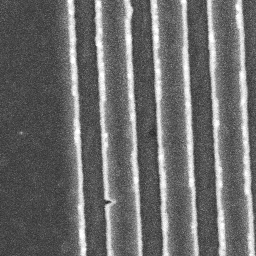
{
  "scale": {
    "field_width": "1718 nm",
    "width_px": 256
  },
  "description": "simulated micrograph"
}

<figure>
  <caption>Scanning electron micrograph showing parallel lines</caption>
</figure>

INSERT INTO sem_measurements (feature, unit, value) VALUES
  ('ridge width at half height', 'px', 32.5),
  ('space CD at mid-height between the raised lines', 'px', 23.7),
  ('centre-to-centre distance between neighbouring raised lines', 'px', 56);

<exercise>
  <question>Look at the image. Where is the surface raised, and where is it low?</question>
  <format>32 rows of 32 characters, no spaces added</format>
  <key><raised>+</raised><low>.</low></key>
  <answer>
+++++++++...++++...++++...++++..
+++++++++...++++...++++...++++..
+++++++++...++++...++++...++++..
+++++++++...++++...++++...++++..
+++++++++...++++...++++...++++..
+++++++++...++++...++++...++++..
+++++++++...++++...++++...++++..
+++++++++...++++...++++...++++..
+++++++++...++++...++++...++++..
++++++++++..++++....+++....+++..
++++++++++...+++....++++...++++.
++++++++++...++++...++++...++++.
++++++++++...++++...++++...++++.
++++++++++...++++...++++...++++.
++++++++++...++++...++++...++++.
++++++++++...++++...++++...++++.
++++++++++...++++...++++...++++.
++++++++++...++++...++++...++++.
++++++++++...++++...++++...++++.
++++++++++...++++...++++...++++.
++++++++++...++++...++++...++++.
++++++++++...++++...++++...++++.
++++++++++...++++...++++...++++.
++++++++++...++++...++++...++++.
++++++++++...++++...++++...++++.
++++++++++....+++...++++...++++.
++++++++++...++++...++++...++++.
++++++++++...++++...++++...++++.
++++++++++....+++...++++...++++.
+++++++++++...++++...+++....+++.
+++++++++++...++++...++++...++++
+++++++++++...++++...++++...++++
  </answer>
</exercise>